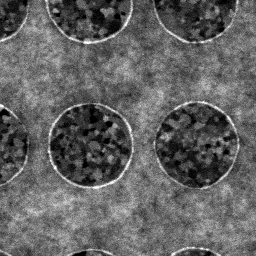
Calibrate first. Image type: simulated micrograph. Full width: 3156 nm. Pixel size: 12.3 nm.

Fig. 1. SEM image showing raised bodies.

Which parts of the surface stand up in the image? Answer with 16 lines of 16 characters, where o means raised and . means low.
oo.ooooo..ooooo.
o..ooooo..oooo..
.....oo....oo...
................
................
................
.....o......o...
o...oooo..oooo..
oo.ooooo..ooooo.
oo.ooooo..ooooo.
o..ooooo..oooo..
.....oo....oo...
................
................
................
................